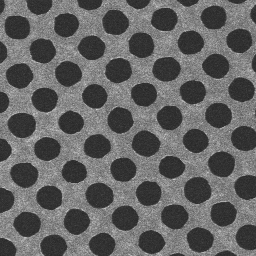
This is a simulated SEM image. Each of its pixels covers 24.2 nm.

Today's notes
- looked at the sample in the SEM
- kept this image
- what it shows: a regular array of holes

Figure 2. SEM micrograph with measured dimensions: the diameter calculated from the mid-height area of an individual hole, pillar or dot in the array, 617 nm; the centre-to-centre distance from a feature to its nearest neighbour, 34.3 px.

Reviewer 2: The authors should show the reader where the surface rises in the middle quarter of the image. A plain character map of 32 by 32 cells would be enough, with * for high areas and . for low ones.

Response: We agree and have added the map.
....******.......*****.......***
....******.......*****.......***
.....*****.......*****.......***
....*******.....*******.....****
...*********...***************..
..****...*********....*******...
*****.....*******......******...
*****......******......******...
*****......******......*******..
*****......*******....********..
******....*********..*****.*****
************....********.....***
....*******......******......***
.....******......******.......**
.....******......******......***
.....******......*******.....***
....********....*********..*****
*.****************....********..
******....*******......*******..
*****......******.......******..
*****.......*****.......******..
*****.......*****.......*******.
*****......********....*********
*******...****..*********....***
*...********.....*******......**
.....*******......******......**
......******......******......**
......******......******......**
.....*******.....*********..****
*...****************...********.
******.....********.....******..
******......******......******..